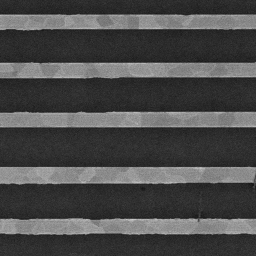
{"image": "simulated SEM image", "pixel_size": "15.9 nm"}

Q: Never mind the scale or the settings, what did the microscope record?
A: lines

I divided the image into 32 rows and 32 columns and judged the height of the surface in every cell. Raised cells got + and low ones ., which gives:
................................
................................
++++++++++++++++++++++++++++++++
++++++++++++++++++++++++++++++++
................................
................................
................................
................................
++++++++++++++++++++++++++++++++
++++++++++++++++++++++++++++++++
................................
................................
................................
................................
++++++++++++++++++++++++++++++++
++++++++++++++++++++++++++++++++
................................
................................
................................
................................
................................
++++++++++++++++++++++++++++++++
++++++++++++++++++++++++++++++++
................................
................................
................................
................................
++.++++++++...++++++++++++++++++
++++++++++++++++++++++++++++++++
................................
................................
................................